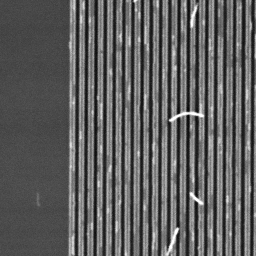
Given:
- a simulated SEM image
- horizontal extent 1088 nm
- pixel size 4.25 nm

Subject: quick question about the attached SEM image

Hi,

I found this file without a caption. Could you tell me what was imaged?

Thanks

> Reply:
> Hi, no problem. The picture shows parallel lines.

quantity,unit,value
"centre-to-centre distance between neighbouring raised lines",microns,0.0392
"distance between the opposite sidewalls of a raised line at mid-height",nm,18.6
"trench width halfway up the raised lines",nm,18.6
